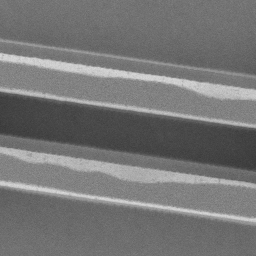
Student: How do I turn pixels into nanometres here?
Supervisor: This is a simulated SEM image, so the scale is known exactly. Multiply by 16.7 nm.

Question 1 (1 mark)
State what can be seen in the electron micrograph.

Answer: lines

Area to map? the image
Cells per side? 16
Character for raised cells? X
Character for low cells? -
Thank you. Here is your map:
----------------
----------------
----------------
XXXXXX----------
XXXXXXXXXXXXXX--
XXXXXXXXXXXXXXXX
-----XXXXXXXXXXX
------------XXXX
----------------
XXXXXXX---------
XXXXXXXXXXXXXX--
XXXXXXXXXXXXXXXX
------XXXXXXXXXX
-------------XXX
----------------
----------------